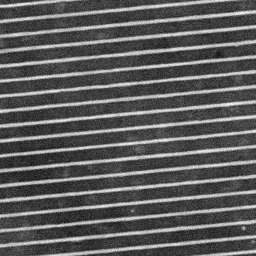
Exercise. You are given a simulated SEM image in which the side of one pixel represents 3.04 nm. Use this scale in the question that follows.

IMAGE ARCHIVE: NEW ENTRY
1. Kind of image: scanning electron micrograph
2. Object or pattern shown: parallel lines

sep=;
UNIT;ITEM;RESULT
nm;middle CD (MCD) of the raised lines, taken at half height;7.9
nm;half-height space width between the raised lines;37.5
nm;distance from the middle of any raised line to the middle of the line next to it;45.4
